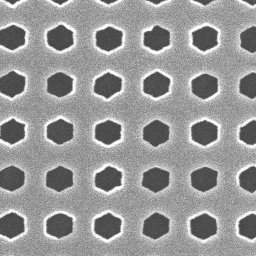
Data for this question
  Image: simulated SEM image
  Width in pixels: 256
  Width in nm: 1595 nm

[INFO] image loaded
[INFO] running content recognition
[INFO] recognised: a regular array of holes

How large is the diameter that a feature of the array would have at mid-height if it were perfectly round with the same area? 163 nanometres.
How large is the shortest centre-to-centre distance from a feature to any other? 290 nanometers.